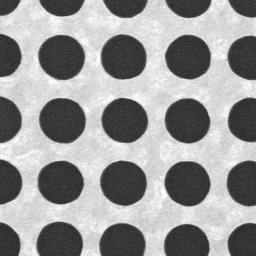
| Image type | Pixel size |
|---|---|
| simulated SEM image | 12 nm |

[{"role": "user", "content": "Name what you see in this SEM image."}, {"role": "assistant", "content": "a regular array of holes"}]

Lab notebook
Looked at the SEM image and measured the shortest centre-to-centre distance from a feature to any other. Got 748 nanometres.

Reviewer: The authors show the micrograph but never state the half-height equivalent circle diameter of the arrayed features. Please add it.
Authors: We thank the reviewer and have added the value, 45.9 pixels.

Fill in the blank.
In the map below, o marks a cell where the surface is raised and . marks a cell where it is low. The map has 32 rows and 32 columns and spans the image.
..ooo.....ooo.....ooo.....ooo...
..oooo....oooo....oooo....ooo...
oooooooooooooooooooooooooooooooo
oooooooooooooooooooooooooooooooo
.oooooo..ooooo..ooooooo.oooooooo
..ooo.....ooo.....ooo.....ooo...
...oo......oo.....ooo.....ooo...
...oo......oo.....ooo.....oo....
..ooo.....ooo.....ooo.....ooo...
.ooooo...ooooo...ooooo...ooooo..
oooooooooooooooooooooooooooooooo
oooooooooooooooooooooooooooooooo
.ooooo...ooooo...ooooo...ooooo..
..ooo.....ooo.....ooo.....ooo...
...oo......oo.....ooo.....ooo...
...oo......oo.....ooo.....ooo...
..ooo.....ooo.....ooo.....ooo...
.ooooo...ooooo...ooooo...ooooo..
oooooooooooooooooooooooooooooooo
oooooooooooooooooooooooooooooooo
.ooooo...ooooo...ooooo...ooooo..
..ooo.....ooo.....ooo.....ooo...
...oo.....ooo.....ooo.....oo....
...oo.....ooo.....ooo.....oo....
..ooo.....ooo.....ooo.....ooo...
ooooooo.ooooooo..ooooo...ooooo..
oooooooooooooooooooooooooooooooo
oooooooooooooooooooooooooooooooo
..ooo....oooo....ooooo...ooooo..
..ooo.....ooo.....ooo.....ooo...
...oo.....oo......ooo.....oo....
..ooo.....oo......ooo.....ooo...